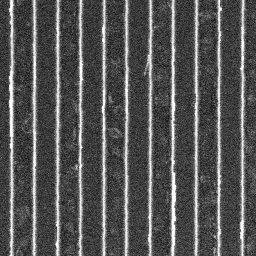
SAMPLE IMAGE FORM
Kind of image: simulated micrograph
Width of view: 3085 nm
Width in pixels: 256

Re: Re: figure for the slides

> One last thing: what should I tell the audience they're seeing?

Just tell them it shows parallel lines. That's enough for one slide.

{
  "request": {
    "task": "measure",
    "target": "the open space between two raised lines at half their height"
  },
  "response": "265 nm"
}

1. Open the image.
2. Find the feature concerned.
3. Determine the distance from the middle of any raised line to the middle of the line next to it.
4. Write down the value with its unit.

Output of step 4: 556 nm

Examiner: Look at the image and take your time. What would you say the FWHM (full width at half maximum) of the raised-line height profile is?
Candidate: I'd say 0.285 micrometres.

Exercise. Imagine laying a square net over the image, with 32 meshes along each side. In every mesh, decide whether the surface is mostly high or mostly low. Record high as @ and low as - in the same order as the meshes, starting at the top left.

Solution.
@@--@@@---@@@---@@@---@@@--@@@--
@---@@@---@@@---@@@---@@@--@@@--
@---@@@---@@@---@@@---@@@--@@@--
@---@@@---@@@---@@@---@@@--@@@--
@---@@@---@@@---@@@---@@@--@@@--
@---@@@---@@@---@@@---@@@--@@@--
@@--@@@---@@@---@@@---@@---@@@--
@@--@@@---@@@---@@@---@@@--@@@--
@@--@@@---@@@---@@@---@@@--@@@--
@---@@@---@@@---@@@---@@@--@@@--
@@--@@@---@@@---@@@---@@@--@@@--
@@--@@@---@@@---@@@---@@@--@@@--
@@--@@@---@@@---@@@---@@@--@@@--
@---@@@---@@@---@@@---@@@--@@@--
@@--@@@---@@@---@@@---@@@--@@@--
@---@@@---@@@---@@@---@@@--@@@--
@@--@@@---@@@---@@@---@@@--@@@--
@@--@@@---@@@---@@@---@@@--@@@--
@@--@@@---@@@---@@@---@@@--@@@--
@---@@@---@@@---@@@---@@@--@@@--
@---@@@---@@@---@@@---@@@--@@@--
@@--@@@---@@@---@@@---@@@--@@@--
@@--@@@---@@@---@@@---@@@--@@@--
@@--@@@---@@@---@@@---@@@--@@@--
@@--@@@---@@@---@@@---@@@--@@@--
@---@@@---@@@---@@@---@@@--@@@--
@---@@@---@@@---@@@---@@@--@@@--
@---@@@---@@@---@@@---@@@--@@@--
@---@@@---@@@---@@@---@@@--@@@--
@---@@@---@@@---@@@---@@@--@@@--
@---@@@---@@@---@@@---@@@--@@@--
@@--@@@---@@@---@@@---@@@--@@@--